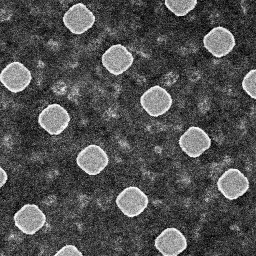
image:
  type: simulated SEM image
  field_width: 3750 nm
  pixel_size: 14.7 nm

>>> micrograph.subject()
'a regular array of raised bodies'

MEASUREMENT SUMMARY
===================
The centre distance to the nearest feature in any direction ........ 824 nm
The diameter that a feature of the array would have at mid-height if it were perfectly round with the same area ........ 413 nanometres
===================